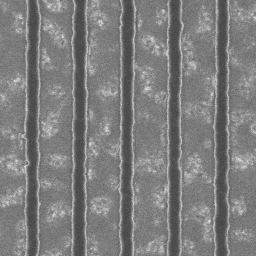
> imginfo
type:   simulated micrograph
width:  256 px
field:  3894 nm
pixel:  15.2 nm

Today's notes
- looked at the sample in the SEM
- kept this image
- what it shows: parallel lines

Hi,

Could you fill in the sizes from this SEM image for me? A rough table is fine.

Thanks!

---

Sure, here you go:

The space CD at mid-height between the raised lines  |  512 nanometers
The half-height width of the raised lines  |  200 nanometers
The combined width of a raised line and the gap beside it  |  720 nm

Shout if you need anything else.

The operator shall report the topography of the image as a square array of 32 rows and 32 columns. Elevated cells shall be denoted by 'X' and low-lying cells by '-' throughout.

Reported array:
---XX----XX----XX----XX----XX---
---XX----XX----XX----XX----XX---
---XX----XX----XX----XX----XX---
---XX----XX----XX----XX----XX---
---XX----XX----XX----XX----XX---
---XX----XX----XX----XX----XX---
---XX----XX----XX----XX----XX---
---XX----XX----XX----XX----XX---
---XX----XX----XX----XX----XX---
---XX----XX----XX----XX----XX---
---XX----XX----XX----XX----XX---
---XX----XX----XX----XX----X----
---XX----XX----XX----XX----XX---
---XX----XX----XX----XX----XX---
---XX----XX----XX----XX----XX---
---XX----XX----XX----XX----XX---
---XX----XX----XX----XX----XX---
---XX----XX----XX----XX----XX---
---XX----XX----XX----XX----XX---
---XX----XX----XX----XX----XX---
---XX----XX----XX----X-----XX---
---XX----XX----XX----XX----XX---
---XX----XX----XX----XX----XX---
---XX----XX----XX----XX----XX---
---XX----XX----XX----XX----X----
---XX----XX----XX----XX----XX---
---XX----XX----XX----XX----XX---
---XX----XX----XX----XX----XX---
---XX----XX----XX----XX----XX---
---XX----XX----XX----XX----X----
---XX----XX----XX----XX----X----
---XX----XX----XX----XX----XX---